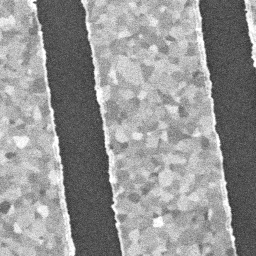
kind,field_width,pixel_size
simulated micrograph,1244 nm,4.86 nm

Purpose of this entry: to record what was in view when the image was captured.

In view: one or a few lines or trenches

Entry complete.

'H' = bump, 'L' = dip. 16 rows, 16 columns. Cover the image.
HHLLLHHHHHHHLLLH
HHLLLHHHHHHHHLLL
HHHLLLHHHHHHHLLL
HHHLLLHHHHHHHLLL
HHHLLLHHHHHHHLLL
HHHLLLHHHHHHHLLL
HHHLLLHHHHHHHLLL
HHHLLLHHHHHHHLLL
HHHLLLLHHHHHHHLL
HHHHLLLHHHHHHHLL
HHHHLLLHHHHHHHLL
HHHHLLLHHHHHHHLL
HHHHLLLHHHHHHHLL
HHHHLLLHHHHHHHLL
HHHHLLLHHHHHHHLL
HHHHHLLLHHHHHHHL